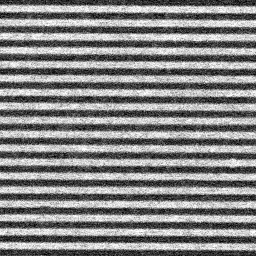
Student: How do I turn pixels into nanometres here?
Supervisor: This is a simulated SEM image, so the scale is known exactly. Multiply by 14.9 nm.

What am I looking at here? parallel lines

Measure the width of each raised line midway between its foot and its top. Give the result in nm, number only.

104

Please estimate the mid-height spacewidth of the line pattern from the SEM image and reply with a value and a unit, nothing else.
104 nanometers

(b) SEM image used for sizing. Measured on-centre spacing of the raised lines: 208 nm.